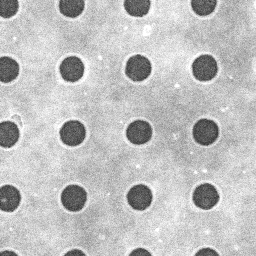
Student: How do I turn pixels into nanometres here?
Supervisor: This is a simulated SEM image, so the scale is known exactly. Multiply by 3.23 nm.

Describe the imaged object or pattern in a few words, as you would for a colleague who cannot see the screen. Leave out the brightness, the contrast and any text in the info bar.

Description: a regular array of holes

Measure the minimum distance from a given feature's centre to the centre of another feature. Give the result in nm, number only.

206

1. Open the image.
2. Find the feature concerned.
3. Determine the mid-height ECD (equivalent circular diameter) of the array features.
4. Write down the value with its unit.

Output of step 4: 93.3 nanometers